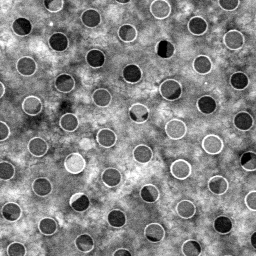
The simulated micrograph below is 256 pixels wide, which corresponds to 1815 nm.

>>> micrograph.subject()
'a regular array of raised bodies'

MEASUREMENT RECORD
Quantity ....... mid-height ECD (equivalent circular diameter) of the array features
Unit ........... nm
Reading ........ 137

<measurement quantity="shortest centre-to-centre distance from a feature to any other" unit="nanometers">280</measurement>